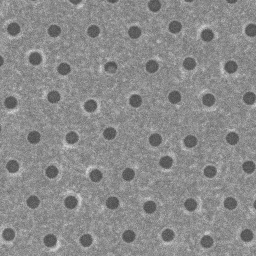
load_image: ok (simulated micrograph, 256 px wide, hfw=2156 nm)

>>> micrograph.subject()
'a regular array of holes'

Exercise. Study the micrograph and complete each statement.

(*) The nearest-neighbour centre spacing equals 300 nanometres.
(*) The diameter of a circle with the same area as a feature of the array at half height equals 14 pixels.